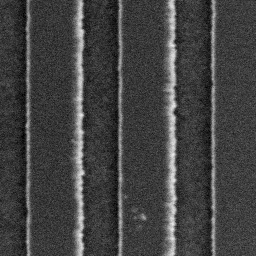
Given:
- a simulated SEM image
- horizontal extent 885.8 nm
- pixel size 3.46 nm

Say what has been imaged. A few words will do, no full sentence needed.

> lines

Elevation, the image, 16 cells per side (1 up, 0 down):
0011100111100111
0011100111100111
0011100111100111
0011100111100111
0011100111100111
0011100111100111
0011100111100111
0011100111100111
0011100111100111
0011100111100111
0011100111100111
0011100111100111
0011100111100111
0011100111100111
0011100111100111
0011100111100111